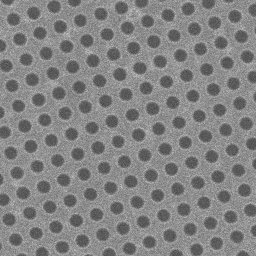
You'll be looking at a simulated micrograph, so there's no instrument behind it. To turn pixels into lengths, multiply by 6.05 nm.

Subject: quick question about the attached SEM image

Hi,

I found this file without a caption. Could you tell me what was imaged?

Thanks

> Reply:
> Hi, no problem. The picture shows a regular array of holes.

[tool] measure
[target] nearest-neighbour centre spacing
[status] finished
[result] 127 nm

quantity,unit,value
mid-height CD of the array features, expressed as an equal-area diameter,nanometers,79.6